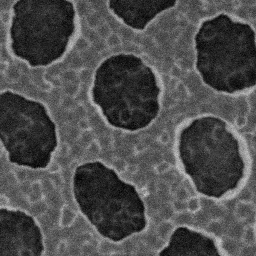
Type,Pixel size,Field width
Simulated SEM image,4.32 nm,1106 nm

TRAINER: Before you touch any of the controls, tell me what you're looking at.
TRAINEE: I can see holes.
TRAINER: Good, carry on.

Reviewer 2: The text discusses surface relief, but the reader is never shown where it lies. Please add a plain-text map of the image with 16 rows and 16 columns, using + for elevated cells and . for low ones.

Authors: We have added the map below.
+....++....+++++
+....+++.++++..+
+...++++++++....
+...+++.++++....
++++++....++....
++++++....+++...
...+++....++++++
...++++...++..++
....+++++++....+
...++++++++....+
+++++..++++....+
+++++...++++...+
+++++....+++++++
..+++....+++++++
...+++...++.++++
...+++++++....++